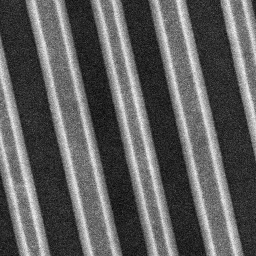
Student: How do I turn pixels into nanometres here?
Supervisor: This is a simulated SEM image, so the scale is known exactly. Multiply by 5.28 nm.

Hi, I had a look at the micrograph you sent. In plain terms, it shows parallel lines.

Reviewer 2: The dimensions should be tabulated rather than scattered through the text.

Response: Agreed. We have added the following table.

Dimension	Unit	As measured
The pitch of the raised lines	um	0.32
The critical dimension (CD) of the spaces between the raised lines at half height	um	0.183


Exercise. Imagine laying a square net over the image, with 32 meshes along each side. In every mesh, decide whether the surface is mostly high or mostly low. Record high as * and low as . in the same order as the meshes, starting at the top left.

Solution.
....****....***....****.....***.
....****....***....****.....***.
....****....***.....***.....****
.....***.....**.....****.....***
.....****....***....****.....***
.....****....***....****.....***
.....****....***.....***.....***
.....****....***.....***......**
......***.....***....****.....**
*.....****....***....****.....**
*.....****....***....****.....**
*.....****....***.....***......*
*......***.....**.....****.....*
**.....****....***....****.....*
**.....****....***....****.....*
**.....****....***.....***.....*
**.....****....***.....***......
***.....****....***....****.....
***.....****....***....****.....
***.....****....***....****.....
***.....****....***.....***.....
****.....***.....**.....****....
.***.....****....***....****....
.***.....****....***....****....
.***.....****....***.....***....
.***......***....***.....***....
..***.....****....***....****...
..***.....****....***....****...
..***.....****....***.....***...
..***.....****.....**.....***...
...***.....***.....***....****..
...***.....****....***....****..